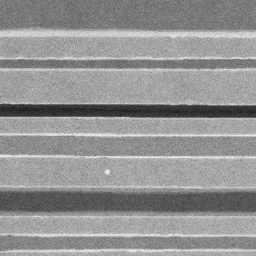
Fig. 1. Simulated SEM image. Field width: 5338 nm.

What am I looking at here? lines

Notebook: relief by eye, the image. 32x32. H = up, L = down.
LLLLLLLLLLLLLLLLLLLLLLLLLLLLLLLL
LLLLLLLLLLLLLLLLLLLLLLLLLLLLLLLL
LLLLLLLLLLLLLLLLLLLLLLLLLLLLLLLL
LLLLLLLLLLLLLLLLLLLLLLLLLLLLLLLL
HHHHHHHHHHHLLLHLLLLLLLLLLLLLLLLL
HHHHHHHHHHHHHHHHHHHHHHHHHHHHHHHH
HHHHHHHHHHHHHHHHHHHHHHHHHHHHHHHH
HHHHHHHHHHHHHHHHHHHHHHHHHHHHHHHH
HHHHHHHHHHHHHHHHHHHHHHHHHHHHHHHH
HHHHHHHHHHHHHHHHHHHHHHHHHHHHHHHH
HHHHHHHHHHHHHHHHHHHHHHHHHHHHHHHH
HHHHHHHHHHHHHHHHHHHHHHHHHHHHHHHH
HHHHHHHHHHHHHHHHHHHHHHHHHHHHHHHH
LLLLLLLLLLLLLLLLLLLLLLLLLLLLLLLL
LLLLLLLLLLLLLLLLLLLLLLLLLLLLLLLL
HHHHHHHHHHHHHHHHHHHHHHHHHHHHHHHH
HHHHHHHHHHHHHHHHHHHHHHHHHHHHHHHH
HHHHHHHHHHHHHHHHHHHHHHHHHHHHHHHH
HHHHHHHHHHHHHHHHHHHHHHHHHHHHHHHH
HHHHHHHHHHHHHHHHHHHHHHHHHHHHHHHH
HHHHHHHHHHHHHHHHHHHHHHHHHHHHHHHH
HHHHHHHHHHHHHHHHHHHHHHHHHHHHHHHH
HHHHHHHHHHHHHHHHHHHHHHHHHHHHHHHH
LLLLLLLLLLLLLLLLLLLLLLLLLLLLLLLL
LLLLLLLLLLLLLLLLLLLLLLLLLLLLLLLL
LLLLLLLLLLLLLLLLLLLLLLLLLLLLLLLL
LLLLLLLLLLLLLLLLLLLLLLLLLLLLLLLL
HHHHHHHHHHHHHHHHHHHHHHHHHHHHHHHH
HHHHHHHHHHHHHHHHHHHHHHHHHHHHHHHH
HHHHHHHHHHHHHHHHHHHHHHHHHHHHHHHH
HHHHHHHHHHHHHHHHHHHHHHHHHHHHHHHH
HHHHHHHHHHHHHHHHHHHHHHHHHHHHHHHH